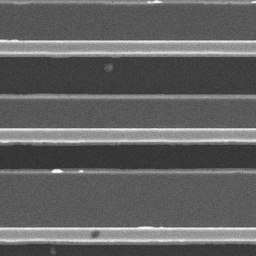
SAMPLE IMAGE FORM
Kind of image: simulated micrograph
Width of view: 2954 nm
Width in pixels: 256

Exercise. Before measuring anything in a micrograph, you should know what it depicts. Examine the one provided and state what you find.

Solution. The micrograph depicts lines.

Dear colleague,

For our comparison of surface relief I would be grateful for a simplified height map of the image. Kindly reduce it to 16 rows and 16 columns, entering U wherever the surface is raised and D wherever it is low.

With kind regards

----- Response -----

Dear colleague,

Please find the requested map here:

UUUUUUUUUUUUUUUU
UUUUUUUUUUUUUUUU
UUUUUUUUUUUUUUUU
DDDDDDDDDDDDDDDD
DDDDDDDDDDDDDDDD
DDDDDDDDDDDDDDDD
UUUUUUUUUUUUUUUU
UUUUUUUUUUUUUUUU
UUUUUUUUUUUUUUUU
DDDDDDDDDDDDDDDD
DDDDDDDDDDDDDDDD
UUUUUUUUUUUUUUUU
UUUUUUUUUUUUUUUU
UUUUUUUUUUUUUUUU
UUUUUUUUUUUUUUUU
DDDDDDDDDDDDDDDD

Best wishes